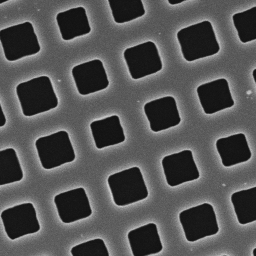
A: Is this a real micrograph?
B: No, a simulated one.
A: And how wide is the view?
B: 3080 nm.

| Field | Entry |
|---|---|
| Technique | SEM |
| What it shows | a regular array of holes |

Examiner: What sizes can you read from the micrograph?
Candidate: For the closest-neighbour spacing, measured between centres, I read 0.668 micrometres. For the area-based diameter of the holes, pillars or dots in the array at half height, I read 421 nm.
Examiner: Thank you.